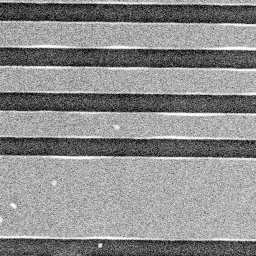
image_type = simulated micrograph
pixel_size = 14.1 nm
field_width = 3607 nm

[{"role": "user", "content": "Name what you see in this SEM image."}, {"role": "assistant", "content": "groups of lines, slits or small figures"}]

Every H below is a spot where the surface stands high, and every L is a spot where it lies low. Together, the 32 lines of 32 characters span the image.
LLLLLLLLLLLLLLLLLLLLLLLLLLLHHHHH
LLLLLLLLLLLLLLLLLLLLLLLLLLLLLLLL
LLLLLLLLLLLLLLLLLLLLLLLLLLLLLLLL
HHHHHHHHHHHHHHHHHHHHHHHHHHHHHHHH
HHHHHHHHHHHHHHHHHHHHHHHHHHHHHHHH
HHHHHHHHHHHHHHHHHHHHHHHHHHHHHHHH
LLLLLLLLLLLLLLLLLLLLLLLLLLLLLLLL
LLLLLLLLLLLLLLLLLLLLLLLLLLLLLLLL
HHHHHHHHHHHHHLLLLLLLLLLLLLLLLLLL
HHHHHHHHHHHHHHHHHHHHHHHHHHHHHHHH
HHHHHHHHHHHHHHHHHHHHHHHHHHHHHHHH
LLLLLHHHHHHHHHHHHHHHHHHHHHHHHHHH
LLLLLLLLLLLLLLLLLLLLLLLLLLLLLLLL
LLLLLLLLLLLLLLLLLLLLLLLLLLLLLLLL
HHHHHHHHHHHHHHHHHHHHHHHHHHHHHHHH
HHHHHHHHHHHHHHHHHHHHHHHHHHHHHHHH
HHHHHHHHHHHHHHHHHHHHHHHHHHHHHHHH
LLLLLLLLLLLLLLLLLLLLLLLLLLLLLLLL
LLLLLLLLLLLLLLLLLLLLLLLLLLLLLLLL
LLLLLLLLLLLLLLLLLLLLLLLLLLLLLLLL
HHHHHHHHHHHHHHHHHHHHHHHHHHHHHHHH
HHHHHHHHHHHHHHHHHHHHHHHHHHHHHHHH
HHHHHHHHHHHHHHHHHHHHHHHHHHHHHHHH
HHHHHHHHHHHHHHHHHHHHHHHHHHHHHHHH
HHHHHHHHHHHHHHHHHHHHHHHHHHHHHHHH
HHHHHHHHHHHHHHHHHHHHHHHHHHHHHHHH
HHHHHHHHHHHHHHHHHHHHHHHHHHHHHHHH
HHHHHHHHHHHHHHHHHHHHHHHHHHHHHHHH
HHHHHHHHHHHHHHHHHHHHHHHHHHHHHHHH
HHHHHHHHHHHHHHHHHHHHHHHHHHHHHHHH
LLLLLLLLLLLLLLLLLLLLLLLLLLLLLLLL
LLLLLLLLLLLLLLLLLLLLLLLLLLLLLLLL